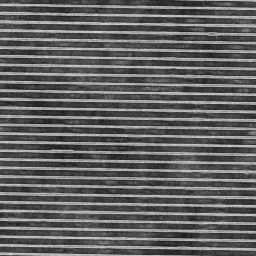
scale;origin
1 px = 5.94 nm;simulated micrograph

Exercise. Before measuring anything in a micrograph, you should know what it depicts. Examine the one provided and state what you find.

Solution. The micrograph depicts parallel lines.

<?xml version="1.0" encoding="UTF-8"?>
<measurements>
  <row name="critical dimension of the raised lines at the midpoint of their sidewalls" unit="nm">10.4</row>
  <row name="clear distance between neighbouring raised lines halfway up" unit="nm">38.6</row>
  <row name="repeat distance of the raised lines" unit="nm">51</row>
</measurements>